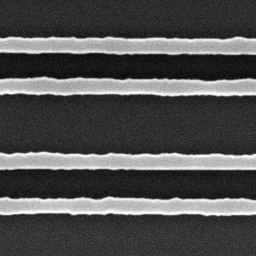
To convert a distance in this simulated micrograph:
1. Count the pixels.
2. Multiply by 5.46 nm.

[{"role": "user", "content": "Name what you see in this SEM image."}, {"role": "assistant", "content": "lines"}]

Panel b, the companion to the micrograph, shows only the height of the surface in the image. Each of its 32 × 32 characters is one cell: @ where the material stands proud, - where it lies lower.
--------------------------------
--------------------------------
--------------------------------
--------------------------------
--------------------------------
@@@@@@@@@@@@@@@@@@@@@@@@@@@@@@@@
@@@@@@@@@@@@@@@@@@@@@@@@@@@@@@@@
--------------------------------
--------------------------------
--------------------------------
@@@@@@@@@@@@@@@@@@@@@@@@@@@@@@@@
@@@@@@@@@@@@@@@@@@@@@@@@@@@@@@@@
--------------------------------
--------------------------------
--------------------------------
--------------------------------
--------------------------------
--------------------------------
--------------------------------
@@@@@@@@@@@@@@@@@@@@@@@@@@@@@-@@
@@@@@@@@@@@@@@@@@@@@@@@@@@@@@@@@
--------------------------------
--------------------------------
--------------------------------
--------------------------------
@@@@@@@@@@@@@@@@@@@@@@@@@@@@@@@@
@@@@@@@@@@@@@@@@@@@@@@@@@@@@@@@@
--------------------------------
--------------------------------
--------------------------------
--------------------------------
--------------------------------